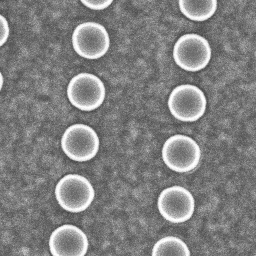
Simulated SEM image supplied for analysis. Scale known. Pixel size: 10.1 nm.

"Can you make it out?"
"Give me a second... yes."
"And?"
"a regular array of raised bodies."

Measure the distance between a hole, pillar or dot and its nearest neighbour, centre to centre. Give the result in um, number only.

0.511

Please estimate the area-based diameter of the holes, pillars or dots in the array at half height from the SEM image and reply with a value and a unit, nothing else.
348 nanometres